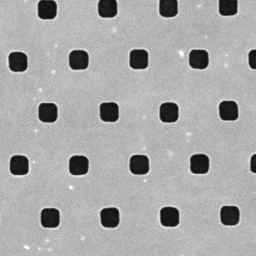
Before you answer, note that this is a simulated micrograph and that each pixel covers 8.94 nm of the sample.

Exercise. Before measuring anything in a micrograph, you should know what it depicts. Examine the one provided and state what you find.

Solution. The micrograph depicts a regular array of holes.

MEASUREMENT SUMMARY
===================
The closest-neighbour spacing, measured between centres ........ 532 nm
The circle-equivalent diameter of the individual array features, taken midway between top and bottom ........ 0.187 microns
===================